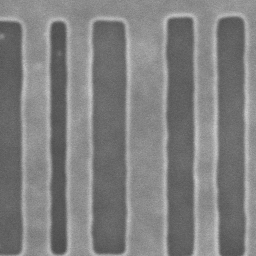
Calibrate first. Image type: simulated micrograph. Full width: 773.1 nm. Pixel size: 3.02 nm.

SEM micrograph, groups of lines, slits or small figures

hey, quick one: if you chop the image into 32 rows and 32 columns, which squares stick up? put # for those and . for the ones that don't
################################
################################
#####################...###...##
...###..###.....#####...###....#
...###..###.....#####...###....#
...###..###.....#####...###....#
...###..###.....#####...###....#
...###..###.....#####...###....#
...###..###.....#####...###....#
...###...##.....#####...###....#
...###..###.....#####...###....#
...###..###.....#####...###....#
...###..###.....#####...###....#
...###..###.....#####...###....#
...###..###.....#####...###....#
...###..###.....#####...###....#
...###..###.....#####...###....#
...###..###.....#####...###....#
...###..###.....#####...###....#
...###..###.....#####...###....#
...###..###.....#####...###....#
...###..###.....#####...###....#
...###..###.....#####...###....#
...###..###.....#####...###....#
...###..###.....#####...###....#
...###..###.....#####...###....#
...###..###.....#####...###....#
...###..###.....#####...###....#
...###..###.....#####...###....#
...###..###.....#####...###....#
...###...##.....#####...###....#
...###..####...######...###....#